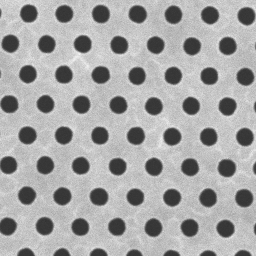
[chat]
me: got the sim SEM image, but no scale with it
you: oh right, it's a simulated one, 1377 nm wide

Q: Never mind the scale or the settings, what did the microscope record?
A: a regular array of holes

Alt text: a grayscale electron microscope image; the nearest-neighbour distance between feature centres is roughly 188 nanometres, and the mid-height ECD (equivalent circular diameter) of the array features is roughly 94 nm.